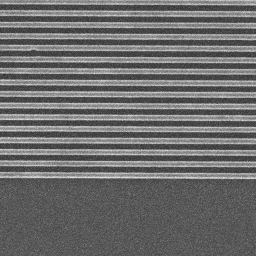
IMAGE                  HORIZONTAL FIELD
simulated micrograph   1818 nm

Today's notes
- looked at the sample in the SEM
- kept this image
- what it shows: parallel lines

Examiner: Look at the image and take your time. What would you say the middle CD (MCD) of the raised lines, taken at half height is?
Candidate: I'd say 31.1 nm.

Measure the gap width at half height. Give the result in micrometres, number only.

0.0488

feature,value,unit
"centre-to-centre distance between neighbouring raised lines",0.0821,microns